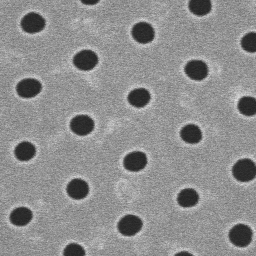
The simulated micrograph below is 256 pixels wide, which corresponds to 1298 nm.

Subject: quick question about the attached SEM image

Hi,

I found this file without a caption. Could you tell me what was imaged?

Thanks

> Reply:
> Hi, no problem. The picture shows a regular array of holes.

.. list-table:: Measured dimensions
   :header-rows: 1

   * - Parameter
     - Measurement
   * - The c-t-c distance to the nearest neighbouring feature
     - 321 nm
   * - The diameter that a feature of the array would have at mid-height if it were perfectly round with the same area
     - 114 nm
